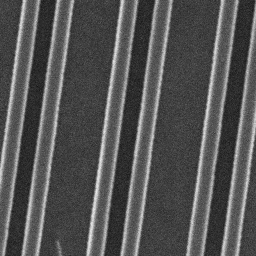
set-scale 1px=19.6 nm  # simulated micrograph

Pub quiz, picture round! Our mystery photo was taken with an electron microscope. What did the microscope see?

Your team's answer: lines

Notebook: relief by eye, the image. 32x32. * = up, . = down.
...**..**......**..**.......**..
...**..**......**..**......***..
...**..**......**..**......**...
..**...**......**..**......**...
..**...**......**..**......**..*
..**..**......**...**......**..*
..**..**......**...**......**..*
..**..**......**..**.......**..*
..**..**......**..**.......**..*
..**..**......**..**......**...*
.**...**......**..**......**...*
.**...**......**..**......**..**
.**..**......**...**......**..**
.**..**......**...**......**..**
.**..**......**..**.......**..**
.**..**......**..**.......**..**
.**..**......**..**......**...**
.**..**......**..**......**...**
**...**......**..**......**..***
**..**.......**..**......**..**.
**..**......**...**......**..**.
**..**......**...**......**..**.
**..**......**..**.......**..**.
**..**......**..**.......**..**.
**..**......**..**......**...**.
*...**......**..**......**...**.
*..**.......**..**......**..**..
*..**......**...**......**..**..
*..**......**...**......**..**..
*..**......**..**.......**..**..
*..**......**..**.......**..**..
*..**......**..**......**...**..